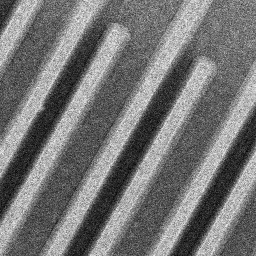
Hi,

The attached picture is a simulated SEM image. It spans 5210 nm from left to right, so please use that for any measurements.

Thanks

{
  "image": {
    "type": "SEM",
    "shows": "parallel lines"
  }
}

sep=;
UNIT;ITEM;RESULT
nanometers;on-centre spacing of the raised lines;926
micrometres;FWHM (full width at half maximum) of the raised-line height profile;0.405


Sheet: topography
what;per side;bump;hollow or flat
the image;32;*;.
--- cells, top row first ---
..***.....***..........***......
.***.....***...........**.......
.***.....***..........***.......
***.....***...*......***........
***.....**...***.....***........
**.....***...**.....***.........
**.....**...***.....***.........
*.....***..***.....***..........
.....***...***.....**...***.....
.....***..***.....***...**.....*
....***...***....***...***.....*
....***..***.....***..***.....**
...***...**.....***...***.....**
...**...***.....***..***.....***
..***..***.....***...**.....***.
.***...***.....**...***.....***.
.***..***.....***..***.....***..
***...***....***...***.....***..
***..***.....***..***.....***...
**...**.....***...***.....**...*
*...***.....***..***.....***..**
*..***.....***...***....***...**
...***.....**...***.....***..***
..***.....***..***.....***...***
..***....***...***.....***..***.
.***.....***..***.....***...**..
.**.....***...***.....**...***..
***.....***..***.....***...**...
**.....***...**......**...***...
**.....**...***.....***..***....
*.....***...**.....***...***....
*....***...***.....***..***.....